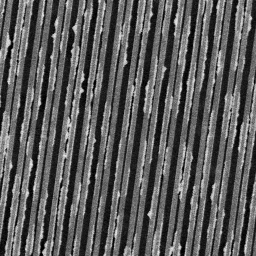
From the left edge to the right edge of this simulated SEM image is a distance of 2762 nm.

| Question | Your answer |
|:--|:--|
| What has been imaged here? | parallel lines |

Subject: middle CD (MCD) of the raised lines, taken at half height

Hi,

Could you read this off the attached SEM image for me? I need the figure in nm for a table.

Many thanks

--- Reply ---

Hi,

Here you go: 61.5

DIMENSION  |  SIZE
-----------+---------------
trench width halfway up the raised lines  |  66.8 nm